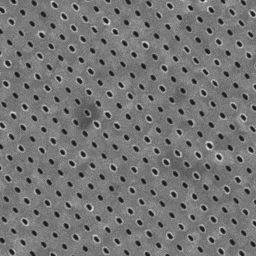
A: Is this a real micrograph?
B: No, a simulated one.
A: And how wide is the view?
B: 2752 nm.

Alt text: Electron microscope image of a regular array of holes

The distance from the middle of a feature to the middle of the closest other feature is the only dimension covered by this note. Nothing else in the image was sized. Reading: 156 nm